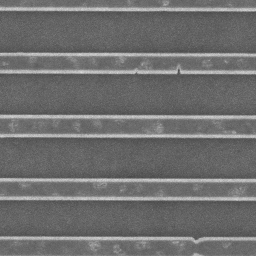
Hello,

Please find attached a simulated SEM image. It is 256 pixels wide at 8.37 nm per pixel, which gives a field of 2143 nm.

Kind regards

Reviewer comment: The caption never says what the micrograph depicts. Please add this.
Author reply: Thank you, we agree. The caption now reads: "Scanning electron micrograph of one or a few lines or trenches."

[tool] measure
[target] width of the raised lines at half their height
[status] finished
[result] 157 nm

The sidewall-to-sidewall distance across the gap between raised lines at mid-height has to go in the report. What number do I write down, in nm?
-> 366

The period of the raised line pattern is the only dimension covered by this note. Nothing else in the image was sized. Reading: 527 nanometers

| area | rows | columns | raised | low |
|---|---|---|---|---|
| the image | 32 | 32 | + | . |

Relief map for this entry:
++++++++++++++++++++++++++++++++
................................
................................
................................
................................
................................
................................
++++++++++++++++++++++++++++++++
++++++++++++++++++++++++++++++++
................................
................................
................................
................................
................................
................................
++++++++++++++++++++++++++++++++
++++++++++++++++++++++++++++++++
................................
................................
................................
................................
................................
++++...++.......................
++++++++++++++++++++++++++++++++
++++++++++++++++++++++++++++++++
................................
................................
................................
................................
................................
++++++++++++++++++++++++++++++++
++++++++++++++++++++++++++++++++